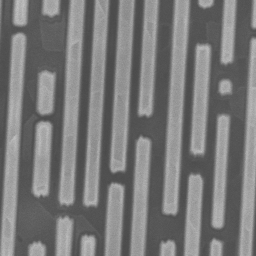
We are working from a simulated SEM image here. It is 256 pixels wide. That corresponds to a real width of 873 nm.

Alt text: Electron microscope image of parallel lines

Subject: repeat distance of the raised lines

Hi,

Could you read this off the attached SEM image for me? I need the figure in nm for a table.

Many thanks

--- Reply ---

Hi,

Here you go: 89.2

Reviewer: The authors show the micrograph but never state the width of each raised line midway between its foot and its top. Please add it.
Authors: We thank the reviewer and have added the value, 52.3 nanometres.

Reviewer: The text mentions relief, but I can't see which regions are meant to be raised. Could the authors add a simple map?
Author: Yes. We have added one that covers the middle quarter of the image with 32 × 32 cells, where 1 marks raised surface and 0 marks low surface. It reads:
01110001110001111001111000011100
01110001110001111001111000011100
01110001110001111001111000011100
11110001110001111001110000011100
11110001110001111001110000111100
11110001110001111001110000111100
11110011110011111001110000111100
11110011110011110001110000111100
11110011110011110001110000111100
11110011110011110001110000111100
11110011110011110001110000111100
11110011110011110001110000111100
11110011110011110001110000111100
11110011110011110000000000111100
11100011100011110000000000111100
11100011100011110000000000111000
11100011110011110000000000111000
11100011110011110000000000111000
11100011100011110001000000111000
11100011100011110011110000111000
11100011100011110011110000111000
11100011100011110011100000111000
11100011100011110011100001111000
11100011100011110011100001111000
11100111100111110011100001111000
11100111100111100011100001111000
11100111100011100011100001111000
11100111100000000011100001111000
11100111100000000011100001111001
11100111100000000011100001111001
11100111100111100011100001111001
11100111100111100111100001111001